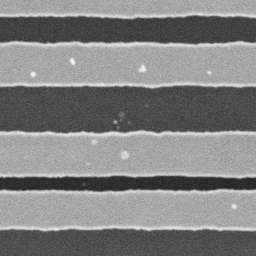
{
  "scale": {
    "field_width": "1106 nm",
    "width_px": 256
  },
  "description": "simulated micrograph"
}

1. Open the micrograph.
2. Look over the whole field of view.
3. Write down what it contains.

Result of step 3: lines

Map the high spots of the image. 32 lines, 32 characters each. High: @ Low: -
@@@@@@@@@@@@@@@@@@@@@@@@@@@@@@@@
@@@@@@@@@@@@@@@@@@@@@@@@@@@@@@@@
--------------------------------
--------------------------------
--------------------------------
@@@@@@@@@@@@@@@@@@@@@@@@-@@@@@@@
@@@@@@@@@@@@@@@@@@@@@@@@@@@@@@@@
@@@@@@@@@@@@@@@@@@@@@@@@@@@@@@@@
@@@@@@@@@@@@@@@@@@@@@@@@@@@@@@@@
@@@@@@@@@@@@@@@@@@@@@@@@@@@@@@@@
@@@@@@@@@@@@@@@@@@@@@@@@@@@@@@@@
--------------------------------
--------------------------------
--------------------------------
--------------------------------
--------------------------------
--@--------------@@----------@--
@@@@@@@@@@@@@@@@@@@@@@@@@@@@@@@@
@@@@@@@@@@@@@@@@@@@@@@@@@@@@@@@@
@@@@@@@@@@@@@@@@@@@@@@@@@@@@@@@@
@@@@@@@@@@@@@@@@@@@@@@@@@@@@@@@@
@@@@@@@@@@@@@@@@@@@@@@@@@@@@@@@@
--------------------------------
--------------------------------
@@@@@@@@@@@@@@@@@@@@@@@@@@@@@@@@
@@@@@@@@@@@@@@@@@@@@@@@@@@@@@@@@
@@@@@@@@@@@@@@@@@@@@@@@@@@@@@@@@
@@@@@@@@@@@@@@@@@@@@@@@@@@@@@@@@
@@@@@@@@@@@@@@@@@@@@@@@@@@@@@@@@
--------------------------------
--------------------------------
--------------------------------